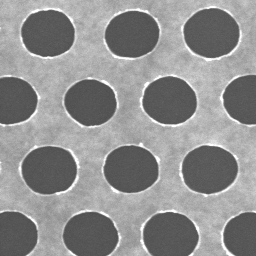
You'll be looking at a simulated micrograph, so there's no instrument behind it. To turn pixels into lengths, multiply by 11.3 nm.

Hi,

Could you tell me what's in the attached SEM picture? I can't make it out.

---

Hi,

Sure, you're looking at a regular array of holes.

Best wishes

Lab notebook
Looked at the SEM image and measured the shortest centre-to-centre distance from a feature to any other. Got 885 nm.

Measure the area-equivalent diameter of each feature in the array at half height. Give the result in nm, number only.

588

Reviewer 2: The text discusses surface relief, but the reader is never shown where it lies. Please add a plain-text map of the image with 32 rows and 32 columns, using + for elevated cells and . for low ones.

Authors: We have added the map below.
++++++++++++++++++++++++++++++++
++++....++++++++..+++++++...++++
+++......+++++.....++++......+++
+++......++++.......+++.......++
+++......++++.......+++.......++
+++......++++.......+++.......++
++++....++++++.....+++++.....+++
++++++++++++++++++++++++++++++++
++++++++++++++++++++++++++++++++
+++++++++++++++++++++++++++++++.
....+++++....++++++....++++++...
....++++......++++......++++....
.....+++.......+++.......+++....
.....+++.......+++.......+++....
....+++++.....+++++.....+++++...
..++++++++...+++++++..++++++++..
++++++++++++++++++++++++++++++++
++++++++++++++++++++++++++++++++
+++++...+++++++...+++++++...++++
+++......++++......++++......+++
+++.......+++.......+++.......++
+++.......+++.......+++.......++
+++......++++.......+++......+++
++++.....+++++....++++++....++++
++++++++++++++++++++++++++++++++
++++++++++++++++++++++++++++++++
..+++++++++.++++++++++++++++++++
....+++++.....+++++.....+++++...
.....+++......++++......++++....
.....+++.......+++.......+++....
.....+++.......+++.......+++....
....+++++.....+++++.....+++++...